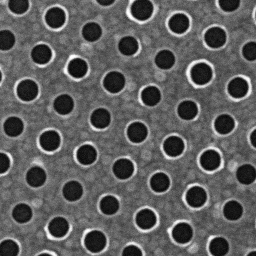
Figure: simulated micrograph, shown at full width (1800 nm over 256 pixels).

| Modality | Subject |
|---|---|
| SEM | a regular array of holes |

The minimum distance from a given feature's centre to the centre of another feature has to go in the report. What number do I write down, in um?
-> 0.273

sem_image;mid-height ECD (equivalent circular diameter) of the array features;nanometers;152